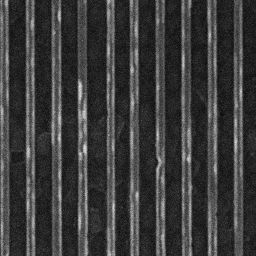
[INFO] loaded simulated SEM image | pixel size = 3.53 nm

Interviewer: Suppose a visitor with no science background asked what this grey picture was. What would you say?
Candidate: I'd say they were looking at parallel lines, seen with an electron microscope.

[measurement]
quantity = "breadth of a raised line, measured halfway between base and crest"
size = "0.0282 um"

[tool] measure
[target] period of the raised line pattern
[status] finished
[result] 91.7 nm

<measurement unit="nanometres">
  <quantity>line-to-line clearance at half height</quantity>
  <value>62.7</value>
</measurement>